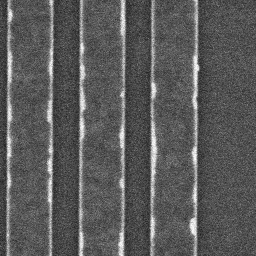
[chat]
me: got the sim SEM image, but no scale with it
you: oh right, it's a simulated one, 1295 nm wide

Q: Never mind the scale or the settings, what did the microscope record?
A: one or a few lines or trenches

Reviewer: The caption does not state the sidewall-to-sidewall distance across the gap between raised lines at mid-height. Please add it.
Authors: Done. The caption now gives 142 nm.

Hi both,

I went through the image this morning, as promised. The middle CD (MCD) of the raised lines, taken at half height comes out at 222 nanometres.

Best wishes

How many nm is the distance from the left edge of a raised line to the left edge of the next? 365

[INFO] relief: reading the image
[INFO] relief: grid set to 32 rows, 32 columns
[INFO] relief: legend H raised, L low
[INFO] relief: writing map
LHHHHHHLLLHHHHHHLLLHHHHHHLLLLLLL
LHHHHHHLLLHHHHHHLLLHHHHHHLLLLLLL
LHHHHHHLLLHHHHHHLLLHHHHHHLLLLLLL
LHHHHHHLLLHHHHHLLLLHHHHHHLLLLLLL
LHHHHHHLLLHHHHHLLLLHHHHHHLLLLLLL
LHHHHHLLLLHHHHHLLLLHHHHHHLLLLLLL
LHHHHHLLLLHHHHHLLLLHHHHHHLLLLLLL
LHHHHHLLLLHHHHHLLLLHHHHHHLLLLLLL
LHHHHHLLLLHHHHHLLLLHHHHHHLLLLLLL
LHHHHHLLLLHHHHHLLLLHHHHHHLLLLLLL
LHHHHHLLLLHHHHHLLLLHHHHHHLLLLLLL
LHHHHHLLLLHHHHHLLLLHHHHHHLLLLLLL
LHHHHHLLLLHHHHHLLLLHHHHHLLLLLLLL
LHHHHHLLLLHHHHHLLLLHHHHHHLLLLLLL
LHHHHHLLLLHHHHHLLLLHHHHHHLLLLLLL
LHHHHHLLLLHHHHHLLLLHHHHHHLLLLLLL
LHHHHHLLLLHHHHHLLLLHHHHHHLLLLLLL
LHHHHHLLLLHHHHHLLLLHHHHHHLLLLLLL
LHHHHHHLLLHHHHHLLLLHHHHHLLLLLLLL
LHHHHHLLLLHHHHHLLLLHHHHHHLLLLLLL
LHHHHHLLLLHHHHHLLLLHHHHHLLLLLLLL
LHHHHHLLLLHHHHHLLLLHHHHHHLLLLLLL
LHHHHHLLLLHHHHHLLLLHHHHHHLLLLLLL
LHHHHHLLLLHHHHHLLLLHHHHHLLLLLLLL
LHHHHHLLLLHHHHHLLLLHHHHHHLLLLLLL
LHHHHHLLLLHHHHHLLLLHHHHHLLLLLLLL
LHHHHHLLLLHHHHHLLLLHHHHHHLLLLLLL
LHHHHHLLLLHHHHHLLLLHHHHHLLLLLLLL
LHHHHHLLLLHHHHHLLLLHHHHHLLLLLLLL
LHHHHHLLLLHHHHHLLLLHHHHHLLLLLLLL
LHHHHHLLLLHHHHHLLLLHHHHHLLLLLLLL
LHHHHHLLLLHHHHHLLLLHHHHHLLLLLLLL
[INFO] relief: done